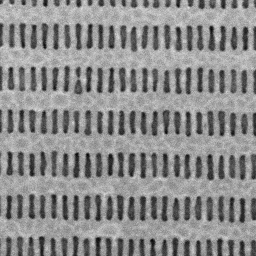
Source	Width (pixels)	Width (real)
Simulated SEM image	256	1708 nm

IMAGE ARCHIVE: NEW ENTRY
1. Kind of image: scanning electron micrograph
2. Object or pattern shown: a regular array of holes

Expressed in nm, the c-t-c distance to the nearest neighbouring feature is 73.4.